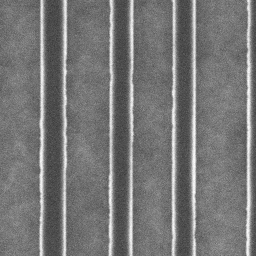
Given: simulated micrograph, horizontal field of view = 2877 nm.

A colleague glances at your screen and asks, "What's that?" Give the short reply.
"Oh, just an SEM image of lines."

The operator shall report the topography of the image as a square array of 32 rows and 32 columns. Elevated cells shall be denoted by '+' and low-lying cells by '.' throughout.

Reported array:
.....+++......+++.....++.......+
.....+++......+++.....++.......+
.....+++......+++.....++.......+
.....+++......++......++.......+
.....+++......+++.....++.......+
.....+++......+++.....++.......+
.....+++......+++.....++.......+
.....+++......+++.....++.......+
.....+++......+++.....++.......+
.....+++......++......++.......+
.....+++......++......++.......+
.....+++......++......++.......+
.....+++......++......++.......+
.....+++......++......++.......+
.....+++......++......++.......+
.....+++......++......++.......+
.....+++......++......++.......+
.....+++......++......++.......+
.....+++......++......++.......+
.....+++......++......++.......+
.....+++......++......++.......+
.....+++......++......++.......+
.....+++......++......++.......+
.....+++......++......++.......+
.....+++......++......++.......+
.....+++......++......++.......+
.....+++......++......++.......+
.....+++......++......++.......+
.....+++......++......++.......+
.....+++......++......++.......+
.....+++......++......++.......+
.....+++......++......++.......+